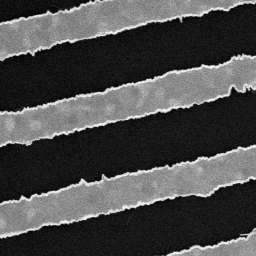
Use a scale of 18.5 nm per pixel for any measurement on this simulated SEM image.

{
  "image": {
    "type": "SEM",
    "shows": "one or a few lines or trenches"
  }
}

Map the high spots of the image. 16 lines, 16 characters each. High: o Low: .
.....ooooooooo..
ooooooooo.......
ooooo...........
o..............o
...........ooooo
.......ooooooooo
...ooooooooo....
oooooooo........
ooo.............
..............oo
..........oooooo
.....oooooooooo.
.ooooooooo......
oooooo..........
oo..............
............oooo